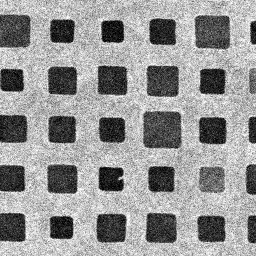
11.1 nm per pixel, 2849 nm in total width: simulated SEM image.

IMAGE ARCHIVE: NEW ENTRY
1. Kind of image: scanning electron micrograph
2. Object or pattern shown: a regular array of holes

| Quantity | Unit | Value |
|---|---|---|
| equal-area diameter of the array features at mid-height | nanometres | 336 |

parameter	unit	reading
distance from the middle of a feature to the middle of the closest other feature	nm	545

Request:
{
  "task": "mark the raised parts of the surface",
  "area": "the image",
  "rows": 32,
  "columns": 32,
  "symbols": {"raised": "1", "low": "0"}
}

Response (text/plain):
11111111111111111111111111111111
11111111111111111111111111111111
00001110011111011110001100000111
00001100011110001110001100000110
00001100011110001110001100000110
00001111111111111110001100000111
11111111111111111111111111111111
11111111111111111111111111111111
11111100011100001100001111011111
00011100001100001100001110001110
00011100001100001100001110001110
10111100001100001100001110001110
11111111111111111111111111111111
11111111111111111111111111111111
00011110011111111100000111111111
00011100001100001100000110001110
00011100001100001100000110001110
00011100011110011100000110001110
11111111111111111110001111111111
11111111111111111111111111111111
11111111111111111111111111111111
00011100001100011100001110001110
00011100001100011100001110001110
00011100001110011110001110001110
11111111111111111111111111111111
11111111111111111111111111111111
11111111111111111111111111111111
00011100011100001100001110001110
00011100011100001100001110001110
00011100011100001100001110001110
11111111111111111111111111111111
11111111111111111111111111111111